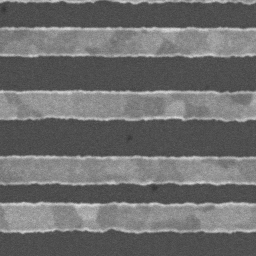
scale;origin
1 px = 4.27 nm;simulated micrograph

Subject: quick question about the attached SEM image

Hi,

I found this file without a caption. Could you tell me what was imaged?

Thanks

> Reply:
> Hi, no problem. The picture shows lines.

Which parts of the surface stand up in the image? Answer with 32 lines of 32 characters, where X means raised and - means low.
--------------------------------
--------------------------------
--------------------------------
X-X-XX--XX-----X--------X-------
XXXXXXXXXXXXXXXXXXXXXXXXXXXXXXXX
XXXXXXXXXXXXXXXXXXXXXXXXXXXXXXXX
XXXXXXXXXXXXXXXXXXXXXXXXXXXXXXXX
--------------------------------
--------------------------------
--------------------------------
--------------------------------
XX-XXXXXXXXXXXXXX-XXXXXXXXX---XX
XXXXXXXXXXXXXXXXXXXXXXXXXXXXXXXX
XXXXXXXXXXXXXXXXXXXXXXXXXXXXXXXX
XXXXXXXXXXXXXXXXXXXXXXXXXXXXXXXX
--------------------------------
--------------------------------
--------------------------------
--------------------------------
--------------------------------
XXXXXXXXXXXXXXXXXXXXXXXXXXXXXXXX
XXXXXXXXXXXXXXXXXXXXXXXXXXXXXXXX
XXXXXXXXXXXXXXXXXXXXXXXXXXXXXXXX
--------------------------------
--------------------------------
XXXXXXXXX----XXX---X---X--X-XXX-
XXXXXXXXXXXXXXXXXXXXXXXXXXXXXXXX
XXXXXXXXXXXXXXXXXXXXXXXXXXXXXXXX
XXXXXXXXXXXXXXXXXXXXXXXXXXXXXXXX
--------------------------------
--------------------------------
--------------------------------